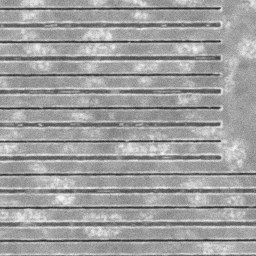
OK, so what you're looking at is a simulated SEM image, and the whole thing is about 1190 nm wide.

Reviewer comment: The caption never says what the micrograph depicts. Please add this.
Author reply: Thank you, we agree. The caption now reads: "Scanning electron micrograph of parallel lines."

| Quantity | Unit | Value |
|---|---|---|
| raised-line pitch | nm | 77.1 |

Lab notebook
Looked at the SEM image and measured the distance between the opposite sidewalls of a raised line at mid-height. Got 59.3 nanometres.